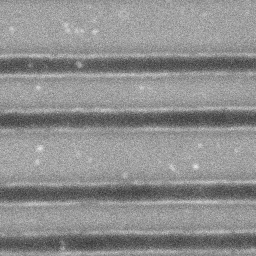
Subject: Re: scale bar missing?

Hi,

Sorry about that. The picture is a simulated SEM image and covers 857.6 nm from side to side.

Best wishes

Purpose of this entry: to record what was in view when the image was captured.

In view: lines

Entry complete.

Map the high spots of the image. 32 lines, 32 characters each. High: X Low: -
--------------------------------
--------------------------------
--------------------------------
--------------------------------
--------------------------------
--------------------------------
--------------------------------
XXXXXXXXXXXXXXXXXXXXXXXXXXXXXXXX
XXXXXXXXXXXXXXXXXXXXXXXXXXXXXXXX
XXXXXXXX------------------------
--------------------------------
--------------------------------
--------------------------------
-------------------------XXXXXXX
XXXXXXXXXXXXXXXXXXXXXXXXXXXXXXXX
XXXXXXXXXXXXXXXXXXXXXXXXXXXXXXXX
--------------------------------
--------------------------------
--------------------------------
--------------------------------
--------------------------------
--------------------------------
--------------------------------
XXXXXXXXXXXXXXXXXXXXXXXXXXXXXXXX
XXXXXXXXXXXXXXXXXXXXXXXXXXXXXXXX
XXXXXXX-------------------------
--------------------------------
--------------------------------
--------------------------------
XXXXXXXXXXXXXXXXXXXXXXXXXXXXXXXX
XXXXXXXXXXXXXXXXXXXXXXXXXXXXXXXX
XXXXXXXXXXXXXXXXXX--------------